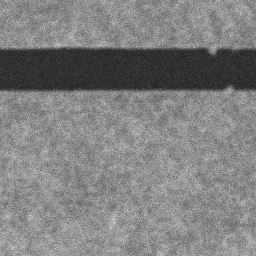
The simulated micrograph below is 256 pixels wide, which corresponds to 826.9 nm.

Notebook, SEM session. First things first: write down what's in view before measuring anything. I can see one or a few lines or trenches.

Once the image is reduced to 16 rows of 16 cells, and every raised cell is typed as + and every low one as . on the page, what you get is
++++++++++++++++
++++++++++++++++
++++++++++++++++
................
................
................
++++++++++++++++
++++++++++++++++
++++++++++++++++
++++++++++++++++
++++++++++++++++
++++++++++++++++
++++++++++++++++
++++++++++++++++
++++++++++++++++
++++++++++++++++